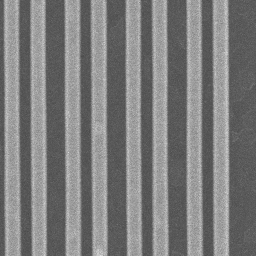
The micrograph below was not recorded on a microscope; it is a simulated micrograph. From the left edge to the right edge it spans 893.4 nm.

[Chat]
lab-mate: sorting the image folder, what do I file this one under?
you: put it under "parallel lines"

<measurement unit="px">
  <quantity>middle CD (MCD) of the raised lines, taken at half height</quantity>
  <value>14.1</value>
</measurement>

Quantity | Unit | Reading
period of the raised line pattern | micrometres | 0.104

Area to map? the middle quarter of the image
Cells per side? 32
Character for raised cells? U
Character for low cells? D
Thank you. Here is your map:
UUUUDDDUUUDDDDDDUUUDDDUUUUDDDDDU
DUUUDDDUUUDDDDDDUUUDDDUUUUDDDDDU
DUUUDDDUUUDDDDDDUUUDDDUUUUDDDDDU
DUUUDDDUUUDDDDDDUUUDDDUUUUDDDDDU
DUUUDDDUUUDDDDDDUUUDDDUUUUDDDDDU
DUUUDDDUUUDDDDDDUUUDDDUUUUDDDDDU
DUUUDDDUUUDDDDDDUUUDDDUUUDDDDDDU
DUUUDDDUUUDDDDDDUUUDDDUUUDDDDDDU
DUUUDDDUUUDDDDDDUUUDDDUUUDDDDDDU
DUUUDDDUUUDDDDDDUUUDDDUUUDDDDDDU
DUUUDDDUUUDDDDDDUUUDDDUUUDDDDDDU
DUUUDDDUUUDDDDDDUUUDDDUUUDDDDDDU
DUUUDDDUUUDDDDDDUUUDDDUUUDDDDDDU
DUUUDDDUUUDDDDDDUUUDDDUUUDDDDDDU
DUUUDDDUUUDDDDDDUUUDDDUUUDDDDDDU
DUUUDDDUUUDDDDDDUUUDDDUUUDDDDDDU
DUUUDDDUUUDDDDDDUUUDDDUUUUDDDDDU
DUUUDDDUUUDDDDDDUUUDDDUUUUDDDDDU
DUUUDDDUUUDDDDDDUUUDDDUUUUDDDDDU
DUUUDDDUUUDDDDDDUUUDDDUUUUDDDDDU
DUUUDDDUUUDDDDDDUUUDDDUUUUDDDDDU
DUUUDDDUUUDDDDDDUUUDDDUUUUDDDDDU
DUUUDDDUUUDDDDDDUUUDDDUUUUDDDDDU
DUUUDDDUUUDDDDDDUUUDDDUUUUDDDDDU
DUUUDDDUUUDDDDDDUUUDDDUUUUDDDDDU
DUUUDDDUUUDDDDDDUUUDDDUUUUDDDDDU
DUUUDDDUUUDDDDDDUUUDDDDUUUDDDDDU
DUUUDDDUUUDDDDDDUUUDDDDUUUDDDDDU
DUUUDDDUUUDDDDDDUUUDDDDUUUDDDDDU
DUUUDDDUUUUDDDDDUUUDDDDUUUDDDDDU
DUUUDDDUUUUDDDDDUUUDDDDUUUDDDDDU
DUUUDDDUUUUDDDDDUUUDDDUUUUDDDDDU